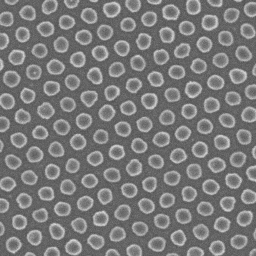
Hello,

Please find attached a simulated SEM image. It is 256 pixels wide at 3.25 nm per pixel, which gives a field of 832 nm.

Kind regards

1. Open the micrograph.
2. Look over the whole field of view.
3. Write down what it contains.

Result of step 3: a regular array of raised bodies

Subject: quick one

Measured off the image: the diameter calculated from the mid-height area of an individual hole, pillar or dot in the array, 48.8 nanometers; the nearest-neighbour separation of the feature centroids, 71.7 nm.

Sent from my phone